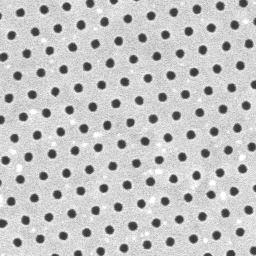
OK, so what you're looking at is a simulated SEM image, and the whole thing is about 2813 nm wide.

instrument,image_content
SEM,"a regular array of holes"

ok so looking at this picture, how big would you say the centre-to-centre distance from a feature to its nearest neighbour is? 254 nanometres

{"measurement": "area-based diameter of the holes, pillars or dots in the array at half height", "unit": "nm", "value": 105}